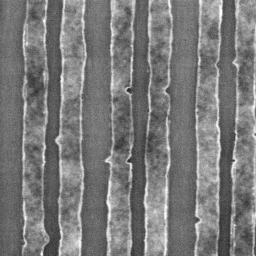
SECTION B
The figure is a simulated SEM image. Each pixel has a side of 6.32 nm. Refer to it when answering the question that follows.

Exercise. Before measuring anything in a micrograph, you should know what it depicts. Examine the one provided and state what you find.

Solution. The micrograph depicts parallel lines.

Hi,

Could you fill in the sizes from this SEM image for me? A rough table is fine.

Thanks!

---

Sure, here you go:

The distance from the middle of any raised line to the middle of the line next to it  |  272 nm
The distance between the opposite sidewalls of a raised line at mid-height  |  138 nm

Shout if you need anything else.